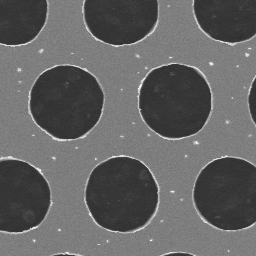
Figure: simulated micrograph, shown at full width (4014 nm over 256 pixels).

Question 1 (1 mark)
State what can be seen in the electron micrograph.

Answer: holes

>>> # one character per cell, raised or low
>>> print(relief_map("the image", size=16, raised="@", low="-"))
---@@-----@@----
---@@-----@@----
--@@@@---@@@@@-@
@@@@@@@@@@@@@@@@
@@@--@@@@---@@@@
@@----@@@----@@@
@@----@@@----@@@
@@----@@@----@@@
@@@--@@@@@--@@@@
@@@@@@@@@@@@@@@@
--@@@@---@@@@---
---@@-----@@----
---@@-----@@----
---@@@---@@@@---
@@@@@@@@@@@@@@@@
@@@@@@@@@@@@@@@@